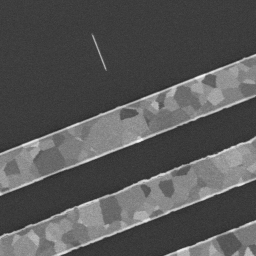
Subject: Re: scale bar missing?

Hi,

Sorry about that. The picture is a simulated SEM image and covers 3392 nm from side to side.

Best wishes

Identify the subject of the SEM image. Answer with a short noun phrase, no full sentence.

one or a few lines or trenches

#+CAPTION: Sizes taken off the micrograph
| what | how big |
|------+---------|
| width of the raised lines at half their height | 37.3 px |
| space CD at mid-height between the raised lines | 0.531 µm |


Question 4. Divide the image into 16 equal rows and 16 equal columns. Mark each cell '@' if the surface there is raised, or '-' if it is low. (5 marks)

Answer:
----------------
----------------
----------------
----------------
-------------@@@
-----------@@@@@
--------@@@@@@@-
------@@@@@@----
---@@@@@@-------
@@@@@@@-------@@
@@@@-------@@@@@
@@------@@@@@@@-
------@@@@@@@---
----@@@@@@------
-@@@@@@-------@@
@@@@@-------@@@@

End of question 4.